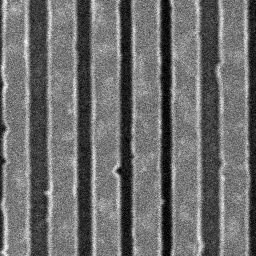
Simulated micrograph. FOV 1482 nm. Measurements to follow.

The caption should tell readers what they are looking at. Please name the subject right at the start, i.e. parallel lines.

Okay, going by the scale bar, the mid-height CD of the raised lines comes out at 168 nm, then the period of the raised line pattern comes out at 0.253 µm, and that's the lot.